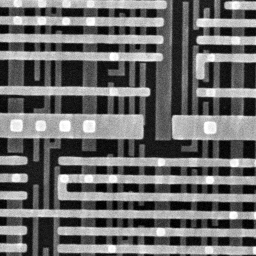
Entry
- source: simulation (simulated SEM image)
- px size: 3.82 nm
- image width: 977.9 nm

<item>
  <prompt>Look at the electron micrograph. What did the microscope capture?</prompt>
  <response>wiring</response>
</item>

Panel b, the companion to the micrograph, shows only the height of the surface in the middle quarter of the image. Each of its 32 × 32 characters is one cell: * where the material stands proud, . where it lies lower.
................................
................................
................................
................................
................................
................................
*********************...........
*********************...........
................................
................................
................................
................................
................................
********************.......*****
********************.......*****
********************.......*****
********************.......*****
********************.......*****
..........*********........*****
................................
................................
................................
................................
*************************.......
********************************
.....................***********
................................
................................
********************************
********************************
*...............................
*...............................